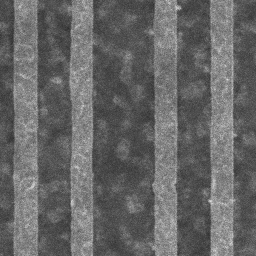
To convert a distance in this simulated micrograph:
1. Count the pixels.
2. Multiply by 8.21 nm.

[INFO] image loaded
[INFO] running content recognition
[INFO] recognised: one or a few lines or trenches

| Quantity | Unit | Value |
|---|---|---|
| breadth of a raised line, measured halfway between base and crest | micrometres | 0.17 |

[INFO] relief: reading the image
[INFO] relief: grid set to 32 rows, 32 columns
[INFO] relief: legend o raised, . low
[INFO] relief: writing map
..ooo....ooo.......ooo....ooo...
..ooo....ooo.......ooo.....oo...
..ooo....ooo.......ooo....ooo...
..ooo....ooo.......ooo....ooo...
..ooo....oo........ooo....ooo...
..ooo....oo........ooo....ooo...
..ooo....oo........ooo....ooo...
..ooo....oo........ooo....ooo...
..ooo....oo........ooo....ooo...
..ooo....oo........o.o....ooo...
..ooo....oo........ooo....ooo...
..ooo....ooo.......ooo....ooo...
..ooo....oo........ooo.....oo...
..ooo....oo........ooo.....oo...
..ooo....ooo.......ooo.....oo...
..ooo....oo........ooo.....oo...
..ooo....oo........ooo....ooo...
..ooo....oo........ooo....ooo...
..ooo....oo........ooo....ooo...
..ooo....oo.........oo.....oo...
..ooo....oo.........oo.....oo...
..ooo....oo........ooo.....oo...
..ooo....ooo.......ooo.....oo...
..ooo....oo........ooo....ooo...
..ooo....oo........ooo....ooo...
..ooo....oo........ooo.....oo...
..ooo....ooo.......ooo.....oo...
..ooo....oo.........oo.....oo...
..ooo....oo........ooo.....oo...
..ooo....oo........ooo....ooo...
..ooo....oo........ooo....ooo...
..ooo....oo........ooo.....oo...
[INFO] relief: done